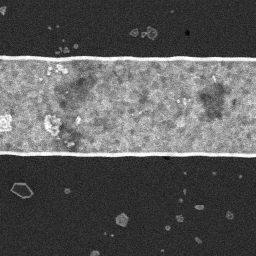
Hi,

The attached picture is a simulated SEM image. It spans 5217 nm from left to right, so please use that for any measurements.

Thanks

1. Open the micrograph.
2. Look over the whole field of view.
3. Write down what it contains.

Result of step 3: wiring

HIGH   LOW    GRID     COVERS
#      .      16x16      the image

................
................
................
................
################
################
################
################
################
################
................
................
................
................
................
................